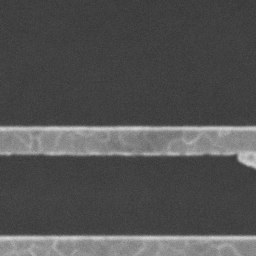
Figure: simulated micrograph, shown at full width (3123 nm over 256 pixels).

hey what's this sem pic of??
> lines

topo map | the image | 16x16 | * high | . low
................
................
................
................
................
................
................
................
****************
****************
................
................
................
................
................
****************